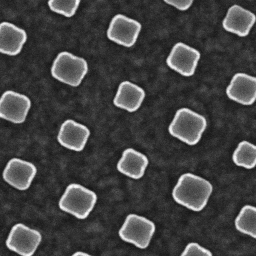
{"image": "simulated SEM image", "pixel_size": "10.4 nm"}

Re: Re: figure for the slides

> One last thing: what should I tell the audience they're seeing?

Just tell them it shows a regular array of raised bodies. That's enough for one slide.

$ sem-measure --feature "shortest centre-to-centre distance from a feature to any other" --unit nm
685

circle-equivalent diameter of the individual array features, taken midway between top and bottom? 317 nanometers